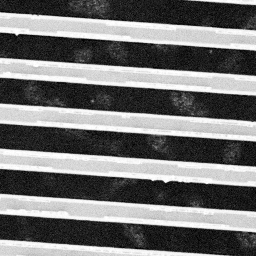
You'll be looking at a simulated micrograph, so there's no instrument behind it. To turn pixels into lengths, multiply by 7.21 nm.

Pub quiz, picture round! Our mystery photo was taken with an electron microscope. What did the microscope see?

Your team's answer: parallel lines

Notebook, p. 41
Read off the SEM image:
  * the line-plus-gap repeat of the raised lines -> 45.2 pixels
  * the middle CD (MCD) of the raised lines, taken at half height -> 126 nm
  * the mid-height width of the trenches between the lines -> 206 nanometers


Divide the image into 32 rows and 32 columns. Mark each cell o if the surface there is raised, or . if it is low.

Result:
................................
................................
oooooooooo......................
oooooooooooooooooooooooo........
..........oooooooooooooooooooooo
........................oooooooo
................................
................................
ooooooooooooo...................
ooooooooooooooooooooooooooooo...
...............ooooooooooooooooo
.............................ooo
................................
oooo............................
oooooooooooooooooo..............
.....ooooooooooooooooooooooooooo
....................oooooooooooo
................................
................................
ooooooooo.......................
ooooooooooooooooooooooo.........
..........oooooooooooooooooooooo
....................oooooooooooo
................................
................................
oooooooooooooo..................
oooooooooooooooooooooooooooo....
..............oooooooooooooooooo
............................oooo
................................
oooo............................
oooooooooooooooooo..............